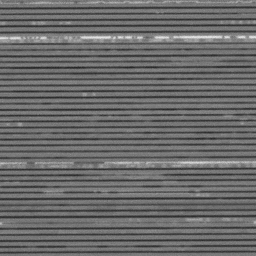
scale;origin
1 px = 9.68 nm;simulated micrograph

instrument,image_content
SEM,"parallel lines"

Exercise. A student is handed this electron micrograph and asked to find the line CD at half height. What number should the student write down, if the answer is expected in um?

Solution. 0.0387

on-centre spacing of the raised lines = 57.8 nm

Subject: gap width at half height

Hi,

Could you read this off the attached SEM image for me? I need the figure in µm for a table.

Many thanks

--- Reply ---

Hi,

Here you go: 0.0194